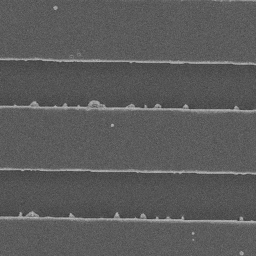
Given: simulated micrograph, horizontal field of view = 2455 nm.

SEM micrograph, lines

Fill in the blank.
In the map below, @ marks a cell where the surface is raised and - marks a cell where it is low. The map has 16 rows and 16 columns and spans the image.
@@@@@@@@@@@@@@@@
@@@@@@@@@@@@@@@@
@@@@@@@@@@@@@@@@
@@@@@@@@@@@@@@@@
----------------
----------------
----------------
@@@@@@@@@@@@@@@@
@@@@@@@@@@@@@@@@
@@@@@@@@@@@@@@@@
@@@@@@@@@@@@@@@@
----------------
----------------
----------------
@@@@@@@@@@@@@@@@
@@@@@@@@@@@@@@@@